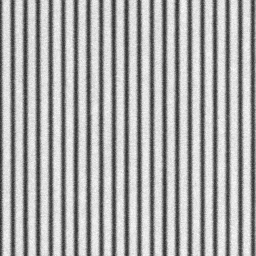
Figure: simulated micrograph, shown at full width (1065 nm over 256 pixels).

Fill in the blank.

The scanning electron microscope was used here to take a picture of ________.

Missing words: parallel lines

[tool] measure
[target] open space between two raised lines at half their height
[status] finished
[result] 0.0182 microns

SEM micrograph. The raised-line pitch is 52.6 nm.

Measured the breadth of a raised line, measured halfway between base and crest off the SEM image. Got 32.3 nm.